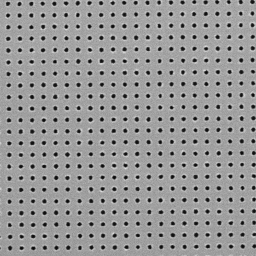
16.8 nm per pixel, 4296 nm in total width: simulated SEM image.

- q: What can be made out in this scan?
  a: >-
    a regular array of holes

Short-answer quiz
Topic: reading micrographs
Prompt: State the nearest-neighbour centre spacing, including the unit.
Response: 192 nm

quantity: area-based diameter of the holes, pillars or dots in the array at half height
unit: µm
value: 0.0733